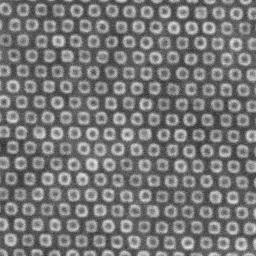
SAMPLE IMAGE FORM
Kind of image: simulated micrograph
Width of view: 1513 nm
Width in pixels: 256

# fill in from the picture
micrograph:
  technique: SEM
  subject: a regular array of raised bodies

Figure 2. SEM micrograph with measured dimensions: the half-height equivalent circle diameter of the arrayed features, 0.0657 micrometres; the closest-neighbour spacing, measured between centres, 0.102 µm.